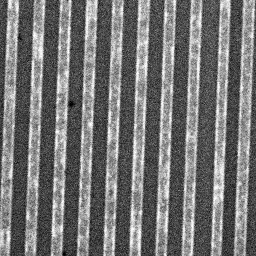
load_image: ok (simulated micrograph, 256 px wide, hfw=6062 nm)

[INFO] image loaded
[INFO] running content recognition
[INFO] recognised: parallel lines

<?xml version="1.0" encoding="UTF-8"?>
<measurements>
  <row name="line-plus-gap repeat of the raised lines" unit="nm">620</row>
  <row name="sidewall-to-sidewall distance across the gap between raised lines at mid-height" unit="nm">396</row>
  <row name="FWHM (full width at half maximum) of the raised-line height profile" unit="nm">240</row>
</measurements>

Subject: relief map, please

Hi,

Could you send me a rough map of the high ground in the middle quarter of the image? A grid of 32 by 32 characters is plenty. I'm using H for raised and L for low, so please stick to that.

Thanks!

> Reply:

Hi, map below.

HLLLLHHLLLLLHHLLLLHHHLLLLHHLLLLH
HLLLLHHLLLLLHHLLLLHHLLLLLHHLLLLH
HLLLLHHLLLLLHHLLLLHHLLLLLHHLLLLH
HLLLLHHLLLLLHHLLLLHHLLLLLHHLLLLH
HLLLLHHLLLLLHHLLLLHHLLLLLHHLLLLH
HLLLLHHLLLLLHHLLLLHHLLLLLHHLLLLH
HLLLLHHLLLLLHHLLLLHHLLLLLHHLLLLH
HLLLLHHLLLLLHHLLLLHHLLLLLHHLLLLH
HLLLLHHLLLLLHHLLLLHHLLLLLHHLLLLH
HLLLLHHLLLLLHHLLLLHHLLLLLHHLLLLH
HLLLLHHLLLLLHHLLLLHHLLLLLHHLLLLH
HLLLLHHLLLLHHHLLLLHHLLLLLHHLLLLH
LLLLLHHLLLLHHHLLLLHHLLLLLHHLLLLH
LLLLLHHLLLLHHHLLLLHHLLLLHHHLLLLH
LLLLLHHLLLLHHLLLLLHHLLLLHHHLLLLH
LLLLLHHLLLLHHLLLLLHHLLLLHHHLLLLH
LLLLLHHLLLLHHLLLLLHHLLLLHHHLLLLH
LLLLLHHLLLLHHLLLLLHHLLLLHHHLLLLH
LLLLHHHLLLLHHLLLLLHHLLLLHHHLLLLH
LLLLHHHLLLLHHLLLLLHHLLLLHHHLLLLH
LLLLHHHLLLLHHLLLLLHHLLLLHHHLLLLH
LLLLHHHLLLLHHLLLLLHHLLLLHHLLLLLH
LLLLHHHLLLLHHLLLLLHHLLLLHHLLLLLH
LLLLHHHLLLLHHLLLLLHHLLLLHHLLLLLH
LLLLHHHLLLLHHLLLLLHHLLLLHHLLLLLH
LLLLHHHLLLLHHLLLLHHHLLLLHHLLLLLH
LLLLHHLLLLLHHLLLLHHHLLLLHHLLLLLH
LLLLHHLLLLLHHLLLLHHHLLLLHHLLLLHH
LLLLHHLLLLLHHLLLLHHLLLLLHHLLLLHH
LLLLHHLLLLLHHLLLLHHLLLLLHHLLLLHH
LLLLHHLLLLLHHLLLLHHLLLLLHHLLLLHH
LLLLHHLLLLLHHLLLLHHLLLLLHHLLLLHH